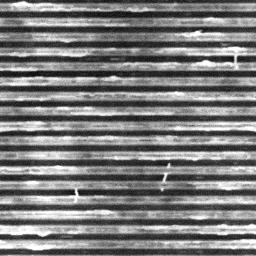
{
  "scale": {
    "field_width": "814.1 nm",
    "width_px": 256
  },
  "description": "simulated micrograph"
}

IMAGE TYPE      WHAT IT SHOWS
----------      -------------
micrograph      parallel lines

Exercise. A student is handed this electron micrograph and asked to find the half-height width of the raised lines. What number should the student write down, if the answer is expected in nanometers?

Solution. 25.5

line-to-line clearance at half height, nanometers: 22.7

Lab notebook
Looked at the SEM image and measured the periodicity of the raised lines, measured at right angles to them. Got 47.1 nanometers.